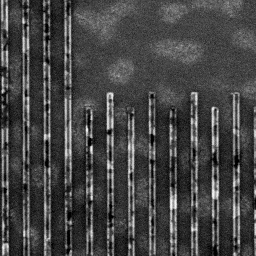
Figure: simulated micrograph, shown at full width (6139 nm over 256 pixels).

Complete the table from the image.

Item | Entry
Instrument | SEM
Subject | parallel lines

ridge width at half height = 102 nanometers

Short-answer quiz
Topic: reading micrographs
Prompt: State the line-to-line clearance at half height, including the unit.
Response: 390 nm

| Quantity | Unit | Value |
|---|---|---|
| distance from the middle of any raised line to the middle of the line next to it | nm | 504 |